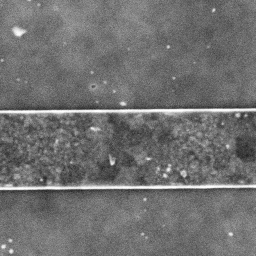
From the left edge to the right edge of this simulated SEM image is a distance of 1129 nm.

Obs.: wiring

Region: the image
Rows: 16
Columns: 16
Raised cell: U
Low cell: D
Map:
DDDDDDDDDDDDDDDD
DDDDDDDDDDDDDDDD
DDDDDDDDDDDDDDDD
DDDDDDDDDDDDDDDD
DDDDDDDDDDDDDDDD
DDDDDDDDDDDDDDDD
DDDDDDDDDDDDDDDD
UUUUUUUUUUUUUUUU
UUUUUUUUUUUUUUUU
UUUUUUUUUUUUUUUU
UUUUUUUUUUUUUUUU
UUUUUUUUUUUUUUUU
DDDDDDDDDDDDDDDD
DDDDDDDDDDDDDDDD
DDDDDDDDDDDDDDDD
DDDDDDDDDDDDDDDD